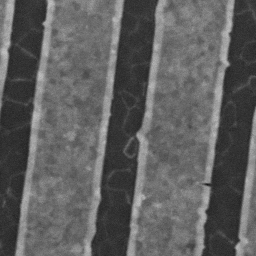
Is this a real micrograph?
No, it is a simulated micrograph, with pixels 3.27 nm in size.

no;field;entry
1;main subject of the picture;one or a few lines or trenches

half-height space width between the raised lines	0.131	microns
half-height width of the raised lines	224	nanometres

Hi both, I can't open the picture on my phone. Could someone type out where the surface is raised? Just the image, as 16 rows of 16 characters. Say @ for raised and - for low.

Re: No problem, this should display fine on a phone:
@--@@@@---@@@@--
@--@@@@---@@@@--
---@@@@---@@@@--
---@@@@---@@@@--
---@@@@---@@@@--
--@@@@@--@@@@@--
--@@@@@--@@@@@--
--@@@@@--@@@@---
--@@@@---@@@@---
--@@@@---@@@@---
--@@@@---@@@@---
--@@@@---@@@@---
--@@@@---@@@@--@
-@@@@@--@@@@@--@
-@@@@@--@@@@@--@
-@@@@---@@@@@--@